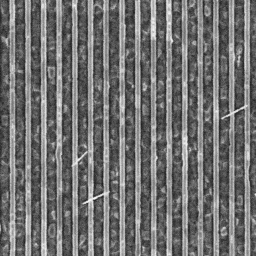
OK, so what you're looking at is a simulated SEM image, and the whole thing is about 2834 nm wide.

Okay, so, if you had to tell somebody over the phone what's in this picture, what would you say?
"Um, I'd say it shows parallel lines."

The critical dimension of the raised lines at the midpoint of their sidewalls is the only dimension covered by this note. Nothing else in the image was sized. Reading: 0.047 micrometres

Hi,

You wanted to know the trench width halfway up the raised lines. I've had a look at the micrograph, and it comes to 11.8 px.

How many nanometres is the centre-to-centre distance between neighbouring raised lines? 173